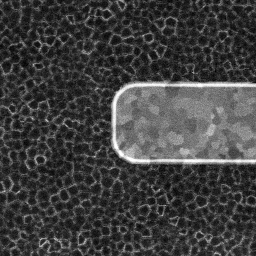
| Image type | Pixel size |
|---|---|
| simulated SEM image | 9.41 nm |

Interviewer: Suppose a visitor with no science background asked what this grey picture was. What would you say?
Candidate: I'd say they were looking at one or a few lines or trenches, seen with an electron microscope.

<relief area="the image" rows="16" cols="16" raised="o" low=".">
................
................
................
................
................
........oooooooo
.......ooooooooo
.......ooooooooo
.......ooooooooo
........oooooooo
................
................
................
................
................
................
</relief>